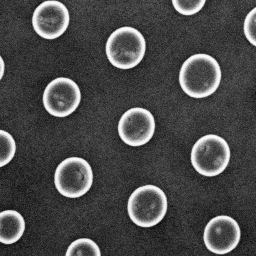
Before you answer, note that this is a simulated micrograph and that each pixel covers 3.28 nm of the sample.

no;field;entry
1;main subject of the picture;a regular array of raised bodies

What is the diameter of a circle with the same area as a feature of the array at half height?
123 nm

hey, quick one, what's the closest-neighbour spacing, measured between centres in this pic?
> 260 nm